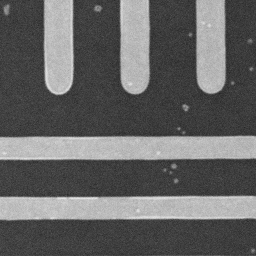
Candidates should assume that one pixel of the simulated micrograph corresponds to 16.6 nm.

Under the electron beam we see groups of lines, slits or small figures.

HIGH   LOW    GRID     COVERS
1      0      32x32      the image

00000011100000011110000001110000
00000011100000011110000001110000
00000011100000011110000001110000
00000011100000011110000001110000
00000011100000011110000001110000
00000011100000011110000001110000
00000011100000011110000001110000
00000011100000011110000001110000
00000011100000011110000001110000
00000011100000011110000001110000
00000011100000011100000001110000
00000001000000001100000000100000
00000000000000000000000000000000
00000000000000000000000000000000
00000000000000000000000000000000
00000000000000000000000000000000
00000000000000000000000000000000
11111111111111111111111111111111
11111111111111111111111111111111
11111111111111111111111111111111
00000000000000000000000000000000
00000000000000000000000000000000
00000000000000000000000000000000
00000000000000000000000000000000
00000000000000000000000000000000
11111111111111111111111111111111
11111111111111111111111111111111
00000000000000000000000000000000
00000000000000000000000000000000
00000000000000000000000000000000
00000000000000000000000000000000
00000000000000000000000000000000